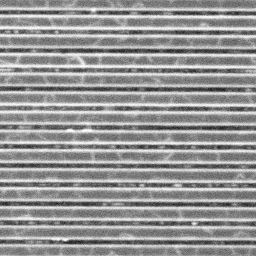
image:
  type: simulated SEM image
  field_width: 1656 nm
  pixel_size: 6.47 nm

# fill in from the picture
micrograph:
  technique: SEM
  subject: parallel lines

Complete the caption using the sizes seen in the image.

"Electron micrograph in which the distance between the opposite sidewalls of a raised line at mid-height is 0.0865 µm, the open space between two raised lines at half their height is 40.4 nanometres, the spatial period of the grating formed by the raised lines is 124 nm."